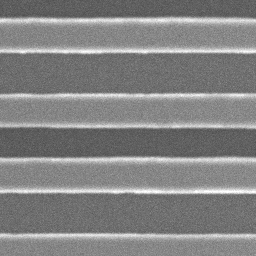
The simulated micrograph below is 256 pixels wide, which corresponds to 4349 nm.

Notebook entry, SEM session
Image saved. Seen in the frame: lines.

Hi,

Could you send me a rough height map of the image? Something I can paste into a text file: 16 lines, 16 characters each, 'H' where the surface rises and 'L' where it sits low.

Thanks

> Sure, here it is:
LLLLLLLLLLLLLLLL
HHHHHHHHHHHHHHHH
HHHHHHHHHHHHHHHH
LLLLLLLLLLLLLLLL
LLLLLLLLLLLLLLLL
LLLLLLLLLLLLLLLL
HHHHHHHHHHHHHHHH
HHHHHHHHHHHHHHHH
LLLLLLLLLLLLLLLL
LLLLLLLLLLLLLLLL
HHHHHHHHHHHHHHHH
HHHHHHHHHHHHHHHH
LLLLLLLLLLLLLLLL
LLLLLLLLLLLLLLLL
LLLLLLLLLLLLLLLL
HHHHHHHHHHHHHHHH